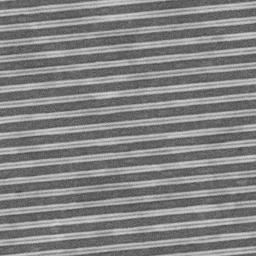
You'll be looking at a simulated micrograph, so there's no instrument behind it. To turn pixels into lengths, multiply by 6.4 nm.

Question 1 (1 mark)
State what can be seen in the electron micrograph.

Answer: parallel lines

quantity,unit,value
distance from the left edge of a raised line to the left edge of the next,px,15.3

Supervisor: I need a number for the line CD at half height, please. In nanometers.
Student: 31.1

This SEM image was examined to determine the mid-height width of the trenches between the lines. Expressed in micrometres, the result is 0.0685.